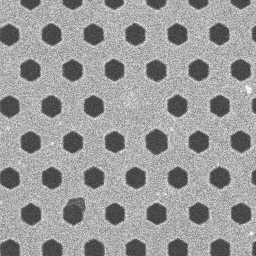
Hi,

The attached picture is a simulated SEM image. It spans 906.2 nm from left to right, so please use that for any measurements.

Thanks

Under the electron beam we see a regular array of holes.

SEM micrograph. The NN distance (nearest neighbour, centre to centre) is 146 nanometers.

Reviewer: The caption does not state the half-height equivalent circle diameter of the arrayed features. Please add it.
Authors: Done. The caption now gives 73.7 nm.